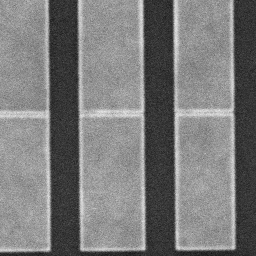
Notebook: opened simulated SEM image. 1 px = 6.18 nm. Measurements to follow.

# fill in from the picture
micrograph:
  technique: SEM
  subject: wiring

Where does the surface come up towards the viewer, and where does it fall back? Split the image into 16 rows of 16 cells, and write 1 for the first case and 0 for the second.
1110011110011100
1110011110011110
1110011110011110
1110011110011110
1110011110011110
1110011110011110
1110011110011110
1110011110011110
1110011110011110
1110011110011110
1110011110011110
1110011110011110
1110011110011110
1110011110011110
1110011110011110
1110011110011100